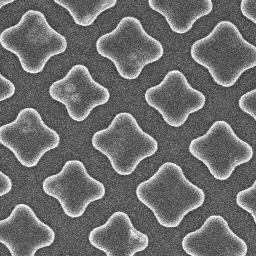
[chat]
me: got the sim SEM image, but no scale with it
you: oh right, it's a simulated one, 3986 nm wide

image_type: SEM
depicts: raised bodies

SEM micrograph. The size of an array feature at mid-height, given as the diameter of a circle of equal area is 51.3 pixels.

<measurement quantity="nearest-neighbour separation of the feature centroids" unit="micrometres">1.05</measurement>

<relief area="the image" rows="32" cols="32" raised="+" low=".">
+......+++++++.....+++++++....++
...++....++++.......++++++....++
...+++...+++...++....++++......+
.+++++.........+++...+++...+++..
++++++++.....++++++.......++++..
++++++++....++++++++....+++++++.
..++++++....++++++++....++++++++
..++++........+++++.....++++++++
...++....++....+++........+++++.
........+++....++....++....+++..
+......+++++........+++....++...
++....+++++++.....+++++++......+
.......++++++.....++++++++....++
........++++.......++++++.....++
..+++....++....+....+++........+
.+++++........+++....++....+....
+++++++.....++++++........+++...
+++++++.....+++++++.....++++++..
.+++++......++++++++....+++++++.
..+++........++++++.....+++++++.
...+....++....+++....+....++++..
........+++....+....+++...+++...
+.....++++++.......++++.........
+....++++++++....++++++++......+
.......++++++....++++++++.....++
........+++.......+++++++.....++
..++....++.........++++........+
+++++.........++....+++...++....
++++++......+++++........++++...
+++++++....+++++++.....+++++++..
.+++++......++++++.....++++++++.
.+++.........++++......++++++++.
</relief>